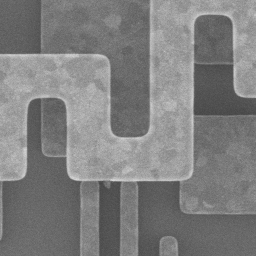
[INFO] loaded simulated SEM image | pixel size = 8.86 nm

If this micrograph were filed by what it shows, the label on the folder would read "wiring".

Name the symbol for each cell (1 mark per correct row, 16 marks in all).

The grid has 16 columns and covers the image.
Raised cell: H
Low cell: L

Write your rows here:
LLLLLLLLLHHHHHHH
LLLLLLLLLHHHLLHH
LLLLLLLLLHHHLLLH
HHHHHHLLLHHHLLLH
HHHHHHHLLHHHLLLH
HHHHHHHLLHHHLLLH
HHLLHHHLLHHHLLLL
HHLLHHHLLHHHLLLL
HHLLHHHLLHHHLLLL
HHLLHHHHHHHHLLLL
HHLLHHHHHHHHLLLL
LLLLLLLLLLLLLLLL
LLLLLLLLLLLLLLLL
LLLLLLLLLLLLLLLL
LLLLLLLLLLLLLLLL
LLLLLLLLLLLLLLLL